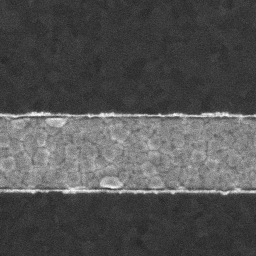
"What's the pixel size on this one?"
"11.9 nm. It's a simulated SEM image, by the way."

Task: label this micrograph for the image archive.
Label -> one or a few lines or trenches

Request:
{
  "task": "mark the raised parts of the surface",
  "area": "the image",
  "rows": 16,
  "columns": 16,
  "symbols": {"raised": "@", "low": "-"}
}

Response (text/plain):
@@@@@@@@@@@@@@@@
@@@@@@@@@@@@@@@@
@@@@@@@@@@@@@@@@
@@@@@@@@@@@@@@@@
@@@@@@@@@@@@@@@@
@@@@@@@@@@@@@@@@
@@@@@@@@@@@@@@@@
-@-@------------
-------@--------
----------------
----------------
---------@------
@@@@@@@@@@@@@@@@
@@@@@@@@@@@@@@@@
@@@@@@@@@@@@@@@@
@@@@@@@@@@@@@@@@